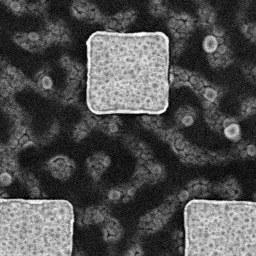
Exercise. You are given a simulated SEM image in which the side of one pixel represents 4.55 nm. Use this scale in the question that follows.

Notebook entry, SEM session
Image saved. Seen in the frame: raised bodies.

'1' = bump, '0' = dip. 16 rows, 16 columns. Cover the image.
0000000000000000
0000000000000000
0000001111000000
0000011111000000
0000011111000000
0000011111000000
0000001111000000
0000000000000000
0000000000000000
0000000000000000
0000000000000000
0000000000000000
1111000000000000
1111100000001111
1111100000001111
1111000000001111